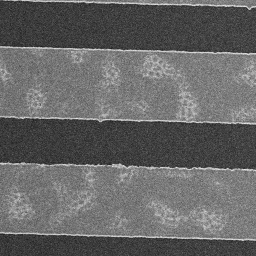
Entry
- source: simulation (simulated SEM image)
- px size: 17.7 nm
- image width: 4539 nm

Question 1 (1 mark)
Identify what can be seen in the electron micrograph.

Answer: one or a few lines or trenches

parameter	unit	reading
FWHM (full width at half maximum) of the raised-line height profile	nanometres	1230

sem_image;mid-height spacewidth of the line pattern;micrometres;0.835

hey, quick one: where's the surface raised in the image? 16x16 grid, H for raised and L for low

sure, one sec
LLLLLLLLLLLLLLLL
LLLLLLLLLLLLLLLL
LLLLLLLLLLLLLLLL
HHHHHHHHHHHHHHHH
HHHHHHHHHHHHHHHH
HHHHHHHHHHHHHHHH
HHHHHHHHHHHHHHHH
LLLLLLLLHHHHHHHH
LLLLLLLLLLLLLLLL
LLLLLLLLLLLLLLLL
HHHHHHHHHHHLLLLL
HHHHHHHHHHHHHHHH
HHHHHHHHHHHHHHHH
HHHHHHHHHHHHHHHH
HHHHHHHHHHHHHHHH
LLLLLLLLLLLLLLLL